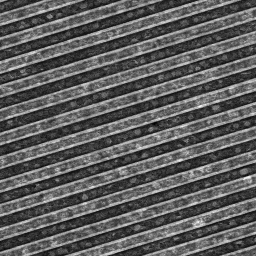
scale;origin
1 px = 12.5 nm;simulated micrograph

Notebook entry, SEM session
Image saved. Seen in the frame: parallel lines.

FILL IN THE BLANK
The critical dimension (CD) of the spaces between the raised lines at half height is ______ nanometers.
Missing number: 156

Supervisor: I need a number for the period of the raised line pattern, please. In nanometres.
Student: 284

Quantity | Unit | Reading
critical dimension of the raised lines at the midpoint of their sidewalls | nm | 124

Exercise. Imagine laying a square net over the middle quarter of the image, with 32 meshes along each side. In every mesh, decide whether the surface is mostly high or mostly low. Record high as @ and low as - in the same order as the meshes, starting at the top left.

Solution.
-@@@@@@@@-----------@@@@@@@@----
@@@@@@----------@@@@@@@@@-------
@@-----------@@@@@@@@@----------
----------@@@@@@@@------------@@
-------@@@@@@@@------------@@@@@
---@@@@@@@@@@----------@@@@@@@@@
@@@@@@@@------------@@@@@@@@----
@@@@@------------@@@@@@@@-------
@@-----------@@@@@@@@@----------
----------@@@@@@@@@----------@@@
-------@@@@@@@@-----------@@@@@@
----@@@@@@@@-----------@@@@@@@@-
@@@@@@@@@-----------@@@@@@@@----
@@@@@-----------@@@@@@@@@-------
@@-----------@@@@@@@@@----------
----------@@@@@@@@@----------@@@
------@@@@@@@@@@----------@@@@@@
---@@@@@@@@@-----------@@@@@@@@-
@@@@@@@@@-----------@@@@@@@@----
@@@@@------------@@@@@@@@-------
@@-----------@@@@@@@@@----------
----------@@@@@@@@-----------@@@
-------@@@@@@@@-----------@@@@@@
---@@@@@@@@@-----------@@@@@@@@-
@@@@@@@@@----------@@@@@@@@@----
@@@@@-----------@@@@@@@@@-------
@@-----------@@@@@@@@-----------
----------@@@@@@@@-----------@@@
------@@@@@@@@@-----------@@@@@@
---@@@@@@@@------------@@@@@@@@-
@@@@@@@@-----------@@@@@@@@@----
@@@@@-----------@@@@@@@@@-------